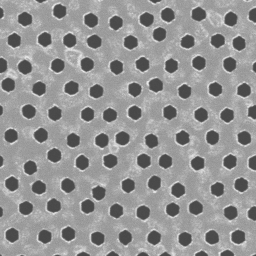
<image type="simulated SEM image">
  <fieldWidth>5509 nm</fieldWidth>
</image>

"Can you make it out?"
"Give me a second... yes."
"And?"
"a regular array of holes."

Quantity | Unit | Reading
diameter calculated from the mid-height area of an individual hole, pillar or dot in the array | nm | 306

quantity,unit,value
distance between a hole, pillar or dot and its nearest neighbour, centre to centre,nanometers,523